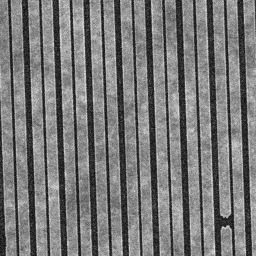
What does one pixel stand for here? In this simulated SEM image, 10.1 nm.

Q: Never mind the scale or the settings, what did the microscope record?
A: parallel lines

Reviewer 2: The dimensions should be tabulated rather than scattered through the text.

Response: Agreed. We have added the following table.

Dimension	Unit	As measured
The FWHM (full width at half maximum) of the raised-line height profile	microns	0.106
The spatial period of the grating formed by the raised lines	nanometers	155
